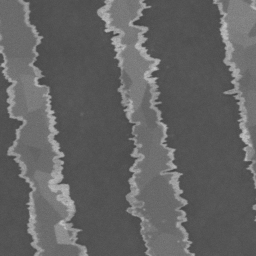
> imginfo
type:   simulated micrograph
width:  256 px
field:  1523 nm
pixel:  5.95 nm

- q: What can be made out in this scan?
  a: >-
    one or a few lines or trenches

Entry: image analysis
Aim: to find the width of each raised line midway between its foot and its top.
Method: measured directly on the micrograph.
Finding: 214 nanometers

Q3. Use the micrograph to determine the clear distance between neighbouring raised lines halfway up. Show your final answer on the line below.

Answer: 0.452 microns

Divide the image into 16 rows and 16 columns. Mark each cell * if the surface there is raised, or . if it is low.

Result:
**....***.....**
**.....**.....**
**.....**.....**
**.....**.....**
**......**.....*
.**.....**.....*
.**.....**.....*
.**.....**.....*
.**.....**.....*
.***....***....*
.***....***.....
..**....***.....
..**....***.....
..**....***.....
..***....***....
..***....***....